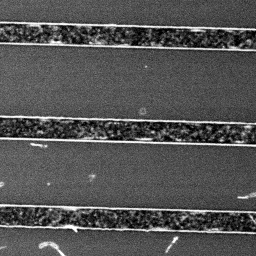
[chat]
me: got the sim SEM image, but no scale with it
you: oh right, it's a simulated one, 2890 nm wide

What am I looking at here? one or a few lines or trenches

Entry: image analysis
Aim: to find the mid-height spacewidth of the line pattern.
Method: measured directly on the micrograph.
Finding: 782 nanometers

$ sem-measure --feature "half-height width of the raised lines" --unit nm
238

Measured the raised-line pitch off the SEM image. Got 1030 nm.